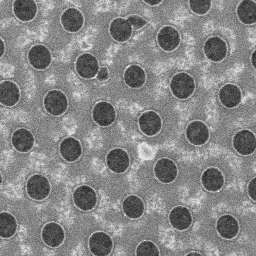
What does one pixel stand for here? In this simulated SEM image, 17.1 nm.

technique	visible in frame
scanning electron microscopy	a regular array of raised bodies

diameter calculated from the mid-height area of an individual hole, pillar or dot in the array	431	nm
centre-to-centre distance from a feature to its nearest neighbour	820	nanometres